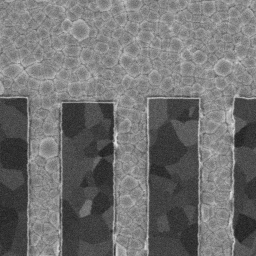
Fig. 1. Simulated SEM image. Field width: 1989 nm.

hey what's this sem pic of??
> one or a few lines or trenches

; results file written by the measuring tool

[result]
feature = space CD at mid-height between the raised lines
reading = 257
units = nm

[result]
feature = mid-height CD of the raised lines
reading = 404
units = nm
